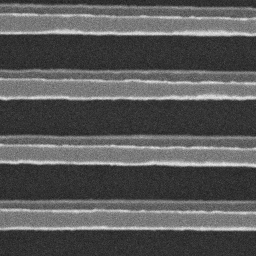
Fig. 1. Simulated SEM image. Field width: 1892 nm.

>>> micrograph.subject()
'lines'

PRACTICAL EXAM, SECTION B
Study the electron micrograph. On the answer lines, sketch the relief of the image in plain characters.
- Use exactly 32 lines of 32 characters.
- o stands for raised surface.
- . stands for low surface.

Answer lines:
................................
oooooooooooooooooooooooooooooooo
oooooooooooooooooooooooooooooooo
oooooooooooooooooooooooooooooooo
................................
................................
................................
................................
................................
oooooooooooooooooooooooooooooooo
oooooooooooooooooooooooooooooooo
oooooooooooooooooooooooooooooooo
................................
................................
................................
................................
................................
oooooooooooooooooooooooooooooooo
oooooooooooooooooooooooooooooooo
oooooooooooooooooooooooooooooooo
.............ooooooooooooooooooo
................................
................................
................................
................................
oooooooooooooooooooooooooooooooo
oooooooooooooooooooooooooooooooo
oooooooooooooooooooooooooooooooo
oooooooooooooooooooooooooooooooo
................................
................................
................................